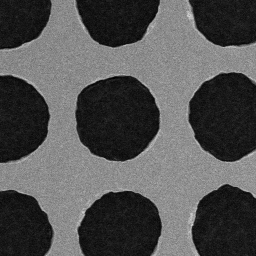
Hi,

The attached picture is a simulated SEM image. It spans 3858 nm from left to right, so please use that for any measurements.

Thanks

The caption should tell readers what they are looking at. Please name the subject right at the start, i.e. holes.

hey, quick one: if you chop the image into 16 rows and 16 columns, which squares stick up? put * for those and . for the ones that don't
...**.....**....
...**....***....
..****...****...
****************
****************
..***....***....
...**.....**....
...**.....**....
...**.....**....
..****...****...
****************
****************
..****...****...
...**.....**....
...**.....**....
...**.....**....